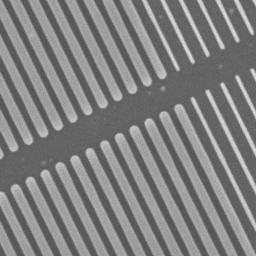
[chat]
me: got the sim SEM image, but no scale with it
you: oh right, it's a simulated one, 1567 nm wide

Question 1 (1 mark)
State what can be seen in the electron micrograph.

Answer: groups of lines, slits or small figures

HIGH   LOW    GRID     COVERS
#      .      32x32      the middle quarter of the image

##..##..###..##...##..###.......
##..###..##...##..###..##.......
###..##..###..###..##..###......
.##..###..##..###..###..#.......
.###..##..###..###..##..........
..##..###..##..###..............
..###..##..###..##..............
...##..###..##..................
#..###..##..##..................
#...##..###.....................
##..###..##.................##..
##...##.....................##..
###..##.................##..###.
.##.....................###.###.
..#.................##..###..###
....................###..###..##
................###..##...##..##
.............#...##..###..##...#
.............##..###..##...##..#
.........##..###..##..###..##...
.........###..##..###..##..###..
......#...##..###..##..###..##..
......##..##..###..###..##..###.
..##..##...##..###..##..###..##.
..##...##..###..##..###..##..###
..###..##...##..###..##..###..##
#..##..###..##...##..###..##..##
#..###..##...##..###..##..###..#
##..##..###..##...##..###..##..#
##..###..##...##..###..##..###..
###..##..###..###..##..###..##..
.##..###..##..###..##...##..###.